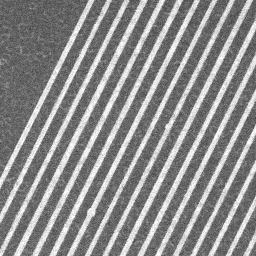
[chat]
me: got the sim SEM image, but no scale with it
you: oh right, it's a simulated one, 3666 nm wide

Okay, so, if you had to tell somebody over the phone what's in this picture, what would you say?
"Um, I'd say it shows parallel lines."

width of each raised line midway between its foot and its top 0.0593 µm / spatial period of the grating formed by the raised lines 226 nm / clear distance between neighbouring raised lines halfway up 165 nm